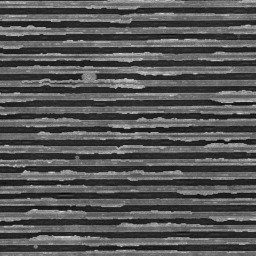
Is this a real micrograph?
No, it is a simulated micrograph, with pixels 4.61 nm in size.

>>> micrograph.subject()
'parallel lines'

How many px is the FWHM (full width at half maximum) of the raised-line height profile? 7.01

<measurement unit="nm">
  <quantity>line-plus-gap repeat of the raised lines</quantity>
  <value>60.6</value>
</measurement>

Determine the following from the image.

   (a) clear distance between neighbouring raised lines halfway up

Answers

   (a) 28.2 nm